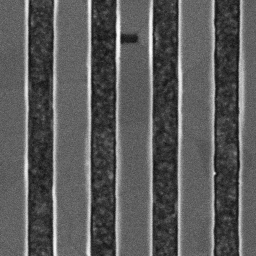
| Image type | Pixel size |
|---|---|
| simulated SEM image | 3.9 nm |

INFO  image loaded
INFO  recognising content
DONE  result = one or a few lines or trenches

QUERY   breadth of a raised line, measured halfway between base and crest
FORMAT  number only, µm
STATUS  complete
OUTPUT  0.14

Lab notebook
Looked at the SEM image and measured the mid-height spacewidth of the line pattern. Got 98.9 nanometers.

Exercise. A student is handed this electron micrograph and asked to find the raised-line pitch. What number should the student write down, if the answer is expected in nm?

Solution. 242